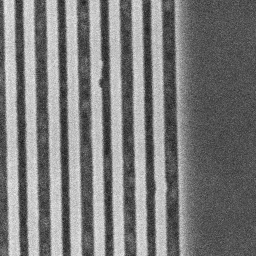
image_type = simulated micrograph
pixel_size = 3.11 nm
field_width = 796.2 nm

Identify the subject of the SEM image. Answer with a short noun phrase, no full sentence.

parallel lines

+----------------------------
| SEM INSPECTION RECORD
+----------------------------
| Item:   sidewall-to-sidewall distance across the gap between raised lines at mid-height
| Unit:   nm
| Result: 35.4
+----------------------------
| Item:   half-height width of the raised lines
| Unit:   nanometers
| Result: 33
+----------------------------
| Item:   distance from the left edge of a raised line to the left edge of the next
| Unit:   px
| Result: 21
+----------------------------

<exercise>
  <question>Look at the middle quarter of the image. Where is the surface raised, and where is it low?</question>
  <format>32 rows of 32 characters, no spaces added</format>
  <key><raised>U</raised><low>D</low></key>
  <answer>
DUUDDDDUUDDDUUDDDUUUDDUUUDDDUUUU
DUUDDDDUUDDDUUDDDUUUDDUUUDDDUUUU
DUUDDDDUUDDDUUDDDUUUDDUUUDDDUUUU
DUUDDDDUUDDDUUDDDUUUDDUUUDDDUUUU
DUUUDDDUUDDDUUDDDUUUDDUUUDDDUUUU
DUUUDDDUUDDDUUDDDUUUDDUUUDDDUUUU
DUUUDDDUUDDDUUDDDUUUDDUUUDDDUUUU
DUUDDDDUUDDDUUDDDUUUDDUUUDDDUUUU
DUUUDDDUUDDDUUDDDDUUDDUUUDDDUUUU
DUUDDDDUUDDDUUDDDDUUDDUUUDDDUUUU
DUUUDDDUUDDDUUDDDDUUDDUUUDDDUUUU
DUUDDDDUUDDDUUDDDDUUDDUUUDDDUUUU
DUUDDDDUUDDDUUDDDDUUDDUUUDDDUUUU
DUUUDDDUUDDDUUDDDDUUDDUUUDDDUUUU
DUUUDDDUUDDDUUDDDDUUDDUUUDDDUUUU
DUUUDDDUUDDDUUDDDDUUDDUUUDDDUUUU
DUUUDDDUUUDDUUDDDDUUDDDUUDDDUUUU
DUUUDDDUUUDDUUDDDDUUDDDUUDDDUUUU
DUUUDDDUUUDDUUDDDDUUDDDUUDDDUUUU
DUUUDDDUUUDDUUDDDDUUDDDUUDDDDUUU
DUUUDDDUUUDDUUDDDDUUDDDUUDDDDUUU
DUUUDDDUUUDDUUDDDDUUDDDUUDDDDUUU
DUUUDDDUUUDDUUDDDDUUDDDUUDDDDUUU
DUUUDDDUUUDDUUDDDDUUDDDUUDDDDUUU
DUUUDDDUUUDDUUUDDDUUDDDUUDDDDUUU
DUUUDDDUUUDDUUUDDDUUDDDUUDDDDUUU
DUUUDDDUUUDDUUUDDDUUDDDUUDDDDUUU
DUUUDDDUUUDDUUUDDDUUDDDUUDDDDUUU
DUUUDDDUUUDDUUUDDDUUDDDUUDDDDUUU
DUUUDDDUUUDDUUUDDDUUDDDUUDDDDUUU
DUUUDDDUUUDDUUUDDDUUDDDUUUDDDUUU
DUUUDDDUUUDDUUUDDDUUUDDUUUDDDUUU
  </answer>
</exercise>